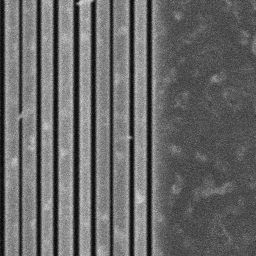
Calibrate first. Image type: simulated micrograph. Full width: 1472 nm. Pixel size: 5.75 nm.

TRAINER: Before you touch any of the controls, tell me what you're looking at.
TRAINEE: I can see parallel lines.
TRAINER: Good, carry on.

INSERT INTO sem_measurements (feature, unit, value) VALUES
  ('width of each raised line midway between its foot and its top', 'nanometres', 79.1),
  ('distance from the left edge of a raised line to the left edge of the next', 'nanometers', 105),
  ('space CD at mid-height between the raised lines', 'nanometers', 29.5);